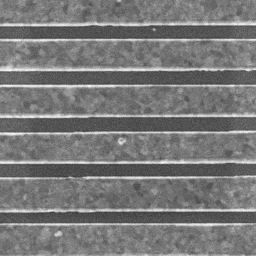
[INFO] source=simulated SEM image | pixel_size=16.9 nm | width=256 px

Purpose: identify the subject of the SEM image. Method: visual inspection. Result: lines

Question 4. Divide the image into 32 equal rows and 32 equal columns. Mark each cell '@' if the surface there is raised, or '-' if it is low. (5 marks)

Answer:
@@@@@@@@@@@@@@@@@@@@@@@@@@@@@@@@
@@@@@@@@@@@@@@@@@@@@@@@@@@@@@@@@
@@@@@@@@@@@@@@@@@@@@@@@@@@@@@@@@
--------------------------------
--------------------------------
@@@@@@@@@@@@@@@@@@@@@@@@@@@@@@@@
@@@@@@@@@@@@@@@@@@@@@@@@@@@@@@@@
@@@@@@@@@@@@@@@@@@@@@@@@@@@@@@@@
@@@@@@@@@@@@@@@@@@@@@@@@@@@@@@@@
--------------------------------
--------------------------------
@@@@@@@@@@@@@@@@@@@@@@@@@@@@@@@@
@@@@@@@@@@@@@@@@@@@@@@@@@@@@@@@@
@@@@@@@@@@@@@@@@@@@@@@@@@@@@@@@@
@@@@@@@@@@@@@@@@@@@@@@@@@@@@@@@@
--------------------------------
-------------------------------@
@@@@@@@@@@@@@@@@@@@@@@@@@@@@@@@@
@@@@@@@@@@@@@@@@@@@@@@@@@@@@@@@@
@@@@@@@@@@@@@@@@@@@@@@@@@@@@@@@@
--------------------------------
--------------------------------
@@@@@@@@@@@@@@@@@@@@@@@@@@@@@@@@
@@@@@@@@@@@@@@@@@@@@@@@@@@@@@@@@
@@@@@@@@@@@@@@@@@@@@@@@@@@@@@@@@
@@@@@@@@@@@@@@@@@@@@@@@@@@@@@@@@
--------------------------------
--------------------------------
@@@@@@@@@@@@@@@@@@@@@@@@@@@@@@@@
@@@@@@@@@@@@@@@@@@@@@@@@@@@@@@@@
@@@@@@@@@@@@@@@@@@@@@@@@@@@@@@@@
@@@@@@@@@@@@@@@@@@@@@@@@@@@@@@@@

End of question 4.